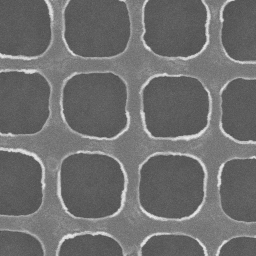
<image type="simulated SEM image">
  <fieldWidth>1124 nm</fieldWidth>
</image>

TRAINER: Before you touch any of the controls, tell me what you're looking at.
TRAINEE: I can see holes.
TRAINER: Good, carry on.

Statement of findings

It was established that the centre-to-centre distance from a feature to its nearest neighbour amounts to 0.35 microns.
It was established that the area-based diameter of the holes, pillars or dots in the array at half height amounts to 0.296 µm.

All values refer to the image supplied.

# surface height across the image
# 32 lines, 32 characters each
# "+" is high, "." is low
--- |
......++........++.......+++....
......++........++........++....
......++........++........++....
......++........++........++....
......++........++........++....
......++........++........++....
......+++......++++......+++....
++++++++++++++++++++++++++++++..
++++++++++++++++++++++++++++++++
.....++++......+++++++++++++++++
......++........++.......++++...
......++........++........++....
......++........++........++....
......++........++........++....
......++........++........++....
......++........++........++....
.....++++......++++......+++....
++++++++++++++++++++++++++++++..
++++++++++++++++++++++++++++++++
....+++++....++++++....+++++++++
.....+++.......+++.......+++....
.....+++.......+++........++....
.....++.........++........++....
.....+++.......++........++.....
.....+++.......++........+++....
.....+++.......+++.......+++....
....+++++.....++++......++++....
++++++++++++++++++++++++++++++..
++++++++++++++++++++++++++++++++
....++++++...++++++....+++++++.+
.....+++.......+++.......+++....
.....++........+++........++....